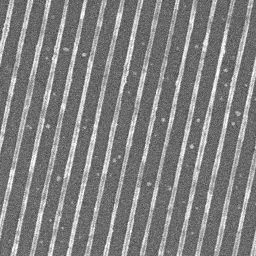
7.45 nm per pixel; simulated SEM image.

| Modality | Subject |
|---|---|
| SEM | parallel lines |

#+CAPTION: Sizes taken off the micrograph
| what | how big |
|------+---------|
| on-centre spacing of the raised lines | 0.134 microns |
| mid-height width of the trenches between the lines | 0.107 micrometres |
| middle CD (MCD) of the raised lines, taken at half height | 26.4 nm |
